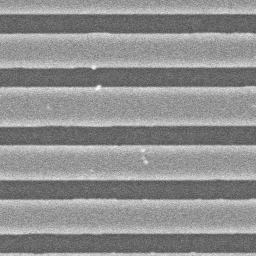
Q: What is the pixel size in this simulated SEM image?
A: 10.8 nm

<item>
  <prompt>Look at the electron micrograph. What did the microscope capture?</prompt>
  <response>lines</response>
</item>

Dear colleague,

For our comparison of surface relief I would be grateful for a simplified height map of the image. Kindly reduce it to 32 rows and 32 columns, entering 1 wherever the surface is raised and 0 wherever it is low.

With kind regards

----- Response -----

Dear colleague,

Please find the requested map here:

11111111111111111111111111111111
11111111111111111111111111111111
00000000000000000000000000000000
00000000000000000000000000000000
11111111111111111111111111111111
11111111111111111111111111111111
11111111111111111111111111111111
11111111111111111111111111111111
00000000000000000000000000000000
00000000000000000000000000000000
00000000000000000000000000000000
11111111111111111111111111111111
11111111111111111111111111111111
11111111111111111111111111111111
11111111111111111111111111111111
11111111111111111111111111111111
00000000000000000000000000000000
00000000000000000000000000000000
11111111111111111111111111111111
11111111111111111111111111111111
11111111111111111111111111111111
11111111111111111111111111111111
00000000000000000000000000000000
00000000000000000000000000000000
00000000000000000000000000000000
11111111111111111111111111111111
11111111111111111111111111111111
11111111111111111111111111111111
11111111111111111111111111111111
00000000000000000000000000000000
00000000000000000000000000000000
00000000000000000000000000000000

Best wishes